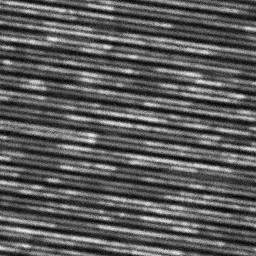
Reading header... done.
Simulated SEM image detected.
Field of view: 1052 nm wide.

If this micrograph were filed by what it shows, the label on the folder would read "parallel lines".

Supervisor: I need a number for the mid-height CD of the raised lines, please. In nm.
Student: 12.2